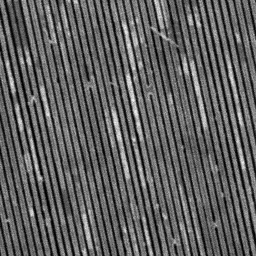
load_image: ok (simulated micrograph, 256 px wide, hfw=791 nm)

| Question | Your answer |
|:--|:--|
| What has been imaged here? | parallel lines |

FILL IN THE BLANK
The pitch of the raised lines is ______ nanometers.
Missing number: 22.3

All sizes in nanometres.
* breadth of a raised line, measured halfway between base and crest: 14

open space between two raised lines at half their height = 8.6 nm